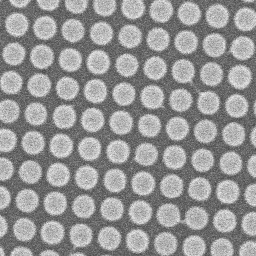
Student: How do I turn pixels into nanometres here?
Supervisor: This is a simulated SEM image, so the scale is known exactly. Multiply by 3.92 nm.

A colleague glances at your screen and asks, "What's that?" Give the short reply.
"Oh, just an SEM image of a regular array of raised bodies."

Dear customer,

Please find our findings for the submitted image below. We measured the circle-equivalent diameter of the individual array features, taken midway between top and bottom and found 86 nm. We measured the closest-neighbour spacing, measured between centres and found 28.2 px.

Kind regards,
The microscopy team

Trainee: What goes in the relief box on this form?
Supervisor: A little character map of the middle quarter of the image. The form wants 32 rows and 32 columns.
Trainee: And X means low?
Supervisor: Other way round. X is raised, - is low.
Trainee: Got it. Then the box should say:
XXXX--XXXXX--XXXXX--XXXXX--XXXXX
-X-----XXX---XXXXX--XXXXX--XXXXX
--------------XXX----XXXX--XXXXX
X---------------------XX----XXXX
XXX---XXX---------------------X-
XXX--XXXXX---XXXX---------------
XXX--XXXXXX--XXXX---XXXX-----X--
XXX--XXXXX--XXXXX--XXXXXX--XXXX-
XX----XXXX---XXXX--XXXXXX--XXXXX
-------X-----XXXX---XXXX---XXXXX
--------------------XXXX---XXXX-
XX----XX--------------------XX--
XXX--XXXX----XXX----------------
XXX--XXXXX--XXXXX--XXXX---------
XX---XXXXX--XXXXX--XXXXX--XXXX--
XX---XXXX---XXXXX--XXXXX--XXXXX-
------XX----XXXX---XXXXX--XXXXX-
--------------------XXX---XXXXX-
X--------------------------XXX--
XX--XXXX----XX------------------
XX--XXXXX--XXXXX---XXX----------
XX--XXXXX--XXXXX--XXXXX---XXX---
X---XXXXX--XXXXX--XXXXX--XXXXX--
-----XXX----XXXX--XXXXX--XXXXX--
-------------X-----XXX---XXXXX--
--------------------------XXX---
X---XXXX----X-------------------
X--XXXXX---XXXX----XX-----------
X--XXXXX--XXXXX--XXXXX---XXXX---
X--XXXXX--XXXXX--XXXXXX--XXXX---
----XXX---XXXXX--XXXXX--XXXXX--X
-----------XXX---XXXXX--XXXXX--X